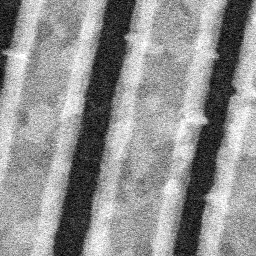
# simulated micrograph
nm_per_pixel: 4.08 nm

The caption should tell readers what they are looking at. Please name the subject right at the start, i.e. one or a few lines or trenches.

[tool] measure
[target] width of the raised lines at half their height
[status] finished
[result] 250 nm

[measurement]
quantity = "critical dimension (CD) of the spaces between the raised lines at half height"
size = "218 nm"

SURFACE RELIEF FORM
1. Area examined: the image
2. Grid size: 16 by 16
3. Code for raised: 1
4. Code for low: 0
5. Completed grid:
0011110001111000
0011110001111000
0011100001111000
0111100001111000
0111100011110001
0111100011110001
0111000011110001
1111000011110001
1111000011100001
1111000111100011
1111000111100011
1110000111100011
1110000111100011
1110000111000011
1110001111000111
1110001111000111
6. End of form